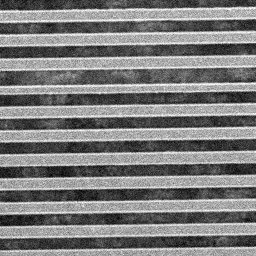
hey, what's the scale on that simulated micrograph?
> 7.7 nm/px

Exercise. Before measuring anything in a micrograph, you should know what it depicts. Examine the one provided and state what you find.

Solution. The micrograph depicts parallel lines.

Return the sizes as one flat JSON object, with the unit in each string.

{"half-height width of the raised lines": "84.6 nanometres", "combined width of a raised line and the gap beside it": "184 nm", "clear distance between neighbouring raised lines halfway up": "98.1 nm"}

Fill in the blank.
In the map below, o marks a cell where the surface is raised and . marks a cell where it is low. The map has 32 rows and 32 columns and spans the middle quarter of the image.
oooooooooooooooooooooooooooooooo
................................
................................
................................
................................
oooooooooooooooooooooooooooooooo
oooooooooooooooooooooooooooooooo
................................
................................
................................
...................ooooooooooooo
oooooooooooooooooooooooooooooooo
oooooooooooooooooooooooooooooooo
................................
................................
................................
...............ooooooooooooooooo
oooooooooooooooooooooooooooooooo
oooooooooooooooooooooooooooooooo
................................
................................
................................
..........oooooooooooooooooooooo
oooooooooooooooooooooooooooooooo
oooooooooooooooooooooooooooooooo
................................
................................
................................
.....ooooooooooooooooooooooooooo
oooooooooooooooooooooooooooooooo
oooooooooooooooooooooooooooooooo
................................